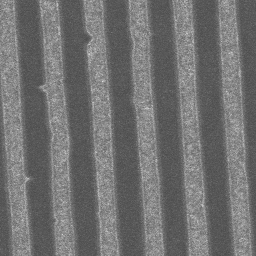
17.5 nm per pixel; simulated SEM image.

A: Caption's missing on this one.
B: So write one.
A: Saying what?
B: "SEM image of parallel lines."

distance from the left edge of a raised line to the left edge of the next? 773 nm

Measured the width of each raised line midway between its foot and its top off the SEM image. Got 340 nm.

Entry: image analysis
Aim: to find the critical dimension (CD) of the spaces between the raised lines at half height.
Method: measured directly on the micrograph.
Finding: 425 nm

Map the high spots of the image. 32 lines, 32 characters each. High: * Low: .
**...**...***...**....**...***..
**...**...***...***...**...***..
**...***...**...***...**...***..
**...***...**...***...**...***..
**...***...**...***...**...***..
**...***...**....**...**...***..
**...***...**...***...**....**..
**....**...**...***...**....**..
**....**...***...**...**....**..
**....**...***...**...***...**..
**...***...***...**...***...**..
***...**...***...**...***...**..
***...**...***...**...***...**..
***...**...***...**....**...**..
***...**....**...**....**...**..
***...**....**...**....**...***.
.**...***...**...**....**...***.
.**...***...**...***...**...***.
.**...***...**...***...**...***.
.**...***...**...***...**...***.
.**...***...**...***...**...***.
.**...***...**....**...**....**.
.**...***...**....**...***...**.
.**...***...**....**...***...**.
.**....**...**....**...***...**.
.**....**...**....**...***...**.
.***...**...**....**...***...**.
.***...**...***...**...***...**.
.***...**...***...**...***...**.
.***...**...***...**...***...**.
.***...**...***...**....**...**.
..**...**...***...***...**...**.